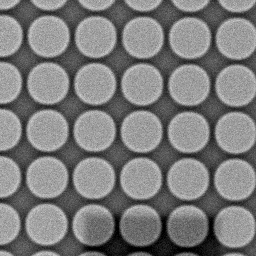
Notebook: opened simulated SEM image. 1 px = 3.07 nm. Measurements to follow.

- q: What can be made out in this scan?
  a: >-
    an array of small figures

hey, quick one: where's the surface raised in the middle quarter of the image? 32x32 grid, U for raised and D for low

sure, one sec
DDDDDUUUUUDDDDDDDUUUUUDDDDDDDDUU
DDDDUUUUUUUUDDDDUUUUUUUDDDDDUUUU
UDDUUUUUUUUUDDDUUUUUUUUUDDDUUUUU
UDDUUUUUUUUUUDDUUUUUUUUUDDUUUUUU
UDDUUUUUUUUUUDUUUUUUUUUUUDUUUUUU
UDDUUUUUUUUUUDUUUUUUUUUUDDUUUUUU
UDDUUUUUUUUUUDDUUUUUUUUUDDUUUUUU
DDDUUUUUUUUUDDDUUUUUUUUUDDDUUUUU
DDDDUUUUUUUUDDDDUUUUUUUDDDDUUUUU
DDDDDUUUUUDDDDDDDUUUUUDDDDDDUUUU
DDDDDDDDDDDDDDDDDDDDDDDDDDDDDDDD
DDDDDDDDDDDDDDDDDDDDDDDDDDDDDDDD
DDDDDUUUUUDDDDDDDUUUUUDDDDDDDUUU
DDDDUUUUUUUUDDDDUUUUUUUDDDDDUUUU
UDDUUUUUUUUUDDDUUUUUUUUUDDDUUUUU
UDDUUUUUUUUUUDDUUUUUUUUUDDUUUUUU
UDDUUUUUUUUUUDUUUUUUUUUUDDUUUUUU
UDDUUUUUUUUUUDUUUUUUUUUUDDUUUUUU
UDDUUUUUUUUUUDDUUUUUUUUUDDUUUUUU
DDDUUUUUUUUUDDDUUUUUUUUUDDDUUUUU
DDDDUUUUUUUDDDDDUUUUUUUDDDDUUUUU
DDDDDDUUUUDDDDDDDUUUUUDDDDDDDUUU
DDDDDDDDDDDDDDDDDDDDDDDDDDDDDDDD
DDDDDDUUDDDDDDDDDDDDDDDDDDDDDDDD
DDDDUUUUUUUDDDDDUUUUUUDDDDDDUUUU
DDDUUUUUUUUUDDDUUUUUUUUDDDDUUUUU
UDDUUUUUUUUUDDDUUUUUUUUUDDDUUUUU
UDUUUUUUUUUUDDUUUUUUUUUUDDUUUUUU
UDUUUUUUUUUUUDUUUUUUUUUUDDUUUUUU
UDUUUUUUUUUUUDUUUUUUUUUUDDUUUUUU
DDDUUUUUUUUUDDDUUUUUUUUUDDUUUUUU
DDDUUUUUUUUUDDDUUUUUUUUUDDDUUUUU